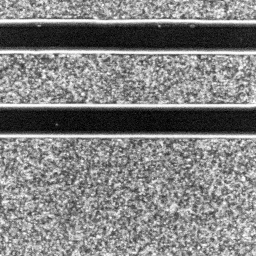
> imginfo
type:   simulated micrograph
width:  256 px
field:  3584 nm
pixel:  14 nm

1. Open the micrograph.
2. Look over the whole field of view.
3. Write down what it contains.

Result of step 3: one or a few lines or trenches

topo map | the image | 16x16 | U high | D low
UUUUUUUUUUUUUUUU
DDDDDDDDDDDDDDDD
DDDDDDDDDDDDDDDD
UUUUUUUUUUUUUUUU
UUUUUUUUUUUUUUUU
UUUUUUUUUUUUUUUU
UUUUUUUUUUUUUUUU
DDDDDDDDDDDDDDDD
DDDDDDDDDDDDDDDD
UUUUUUUUUUUUUUUU
UUUUUUUUUUUUUUUU
UUUUUUUUUUUUUUUU
UUUUUUUUUUUUUUUU
UUUUUUUUUUUUUUUU
UUUUUUUUUUUUUUUU
UUUUUUUUUUUUUUUU